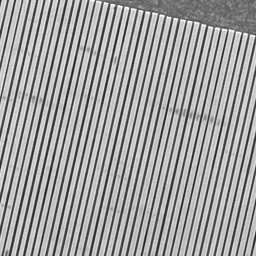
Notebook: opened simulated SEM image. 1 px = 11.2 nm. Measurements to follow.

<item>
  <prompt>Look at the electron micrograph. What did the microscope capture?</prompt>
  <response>parallel lines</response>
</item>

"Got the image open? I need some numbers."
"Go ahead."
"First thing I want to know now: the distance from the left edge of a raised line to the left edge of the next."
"80.3 nm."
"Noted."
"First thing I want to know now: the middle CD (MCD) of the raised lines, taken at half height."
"0.0494 microns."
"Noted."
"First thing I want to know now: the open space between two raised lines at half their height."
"28.8 nm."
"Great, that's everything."